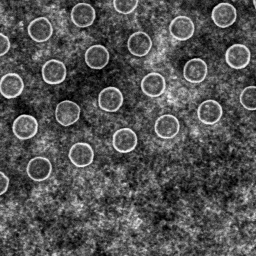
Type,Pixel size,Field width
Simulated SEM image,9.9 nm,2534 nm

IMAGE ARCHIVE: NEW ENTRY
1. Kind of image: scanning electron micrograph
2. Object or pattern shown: a regular array of raised bodies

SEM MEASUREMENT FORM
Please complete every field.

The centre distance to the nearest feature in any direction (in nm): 434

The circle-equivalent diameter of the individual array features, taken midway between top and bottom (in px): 23.1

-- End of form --